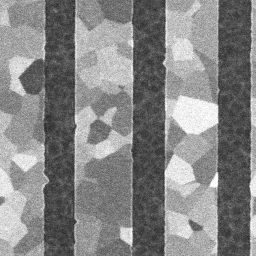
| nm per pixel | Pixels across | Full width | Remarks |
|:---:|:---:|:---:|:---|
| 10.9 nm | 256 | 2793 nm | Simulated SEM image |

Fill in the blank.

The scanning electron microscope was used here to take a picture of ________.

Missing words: one or a few lines or trenches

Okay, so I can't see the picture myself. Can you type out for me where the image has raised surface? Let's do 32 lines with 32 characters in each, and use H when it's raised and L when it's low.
HHHHHHLLLLHHHHHHHLLLLHHHHHHLLLLL
HHHHHHLLLHHHHHHHHLLLLHHHHHHLLLLL
HHHHHHLLLHHHHHHHLLLLLHHHHHHLLLLL
HHHHHHLLLHHHHHHHLLLLLHHHHHHLLLLL
HHHHHHLLLHHHHHHHHLLLLHHHHHHLLLLL
HHHHHHLLLHHHHHHHHLLLLHHHHHHLLLLL
HHHHHLLLLHHHHHHHHLLLLHHHHHHLHLLH
HHHHHLLLLLHHHHHHHLLLLHHHHHHLLLLH
HHHHHLLLLHHHHHHHHLLLLHHHHHHLLLLH
HHHHHHLLLHHHHHHHHLLLLHHHHHHLLLLH
HHHHHHLLLHHHHHHHHLLLLHHHHHHLLLLH
HHHHHHLLLHHHHHHHHLLLLHHHHHHLLHLH
HHHHHHLLLHHHHHHHHLLLLHHHHHHLLLLH
HHHHHHLLLHHHHHHHHLLLLHHHHHHLLHLH
HHHHHLLLLHHHHHHHHLLLHHHHHHHLLLLH
HHHHHLLLLLHHHHHHHLLLLHHHHHHLLLLH
HHHHHHLLLLHHHHHHLLLLLHHHHHHLLLLH
HHHHHHLLLHHHHHHHLLLLLHHHHHHLLLLH
HHHHHHHLLLHHHHHHLLLLLHHHHHHLLLLH
HHHHHHHLLHHHHHHHLLLLLHHHHHHLLLLH
HHHHHHLLLHHHHHHHHLLLLHHHHHHLLLLH
HHHHHLLLLHHHHHHHLLLLLHHHHHHLLLLH
HHHHHHLLLHHHHHHHLLLLLHHHHHHLLLLH
HHHHHLLLLHHHHHHHLLLLLHHHHHHLLLLH
HHHHHLLLLHHHHHHHLLLLLHHHHHHLLLLH
HHHHHHLLLHHHHHHHLLLLLHHHHHHLLLLH
HHHHHLLLHHHHHHHHLLLHLHHHHHHLLLLH
HHHHHLLLLLHHHHHHLLLLLHHHHHHLLLLH
HHHHHLLLLHHHHHHHLLLLLHHHHHHLLLLH
HHHHHLLLLHHHHHHHLLLLLHHHHHHLLLLH
HHHHHLLLLHHHHHHHLLLLLHHHHHHLLLLH
HHHHHLLLLHHHHHHHLLLLLHHHHHHLLLLH